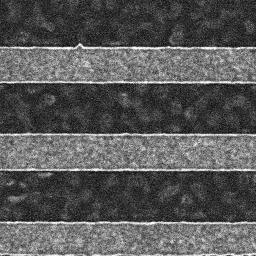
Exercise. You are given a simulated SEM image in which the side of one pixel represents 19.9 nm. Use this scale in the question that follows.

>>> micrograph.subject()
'one or a few lines or trenches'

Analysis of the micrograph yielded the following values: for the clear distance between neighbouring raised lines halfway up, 1040 nanometers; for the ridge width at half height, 701 nanometers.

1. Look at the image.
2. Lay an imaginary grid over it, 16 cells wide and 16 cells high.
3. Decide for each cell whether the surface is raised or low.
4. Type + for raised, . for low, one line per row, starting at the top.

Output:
................
................
................
++++++++++++++++
++++++++++++++++
................
................
................
++++++++++++++++
++++++++++++++++
++++++++++++++++
................
................
................
++++++++++++++++
++++++++++++++++